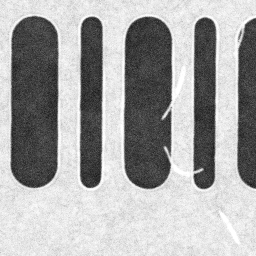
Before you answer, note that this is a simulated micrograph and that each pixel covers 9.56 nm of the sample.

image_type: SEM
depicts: groups of lines, slits or small figures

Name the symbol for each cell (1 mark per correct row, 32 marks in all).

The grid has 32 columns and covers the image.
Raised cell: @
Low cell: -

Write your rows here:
@@@@@@@@@@@@@@@@@@@@@@@@@@@@@@@@
@@@@@@@@@@@@@@@@@@@@@@@@@@@@@@@@
@@----@@@@---@@@@---@@@@@--@@@@-
@@-----@@@---@@@-----@@@---@@@--
@------@@@---@@@-----@@@---@@@--
@------@@@---@@@------@@---@@@--
@------@@@---@@-------@@---@@@--
@------@@@---@@-------@@---@@@--
@------@@@---@@-------@@---@@@--
@------@@@---@@-------@@---@@@--
@------@@@---@@-------@@---@@@--
@------@@@---@@-------@@---@@@--
@------@@@---@@-------@@---@@@--
@------@@@---@@------@@@---@@@--
@------@@@---@@-------@@---@@@--
@------@@@---@@-------@@---@@@--
@------@@@---@@-------@@---@@@--
@------@@@---@@-------@@---@@@--
@------@@@---@@-------@@---@@@--
@------@@@---@@------@@@---@@@--
@------@@@---@@------@@@---@@@--
@------@@@---@@@-----@@@---@@@--
@@-----@@@---@@@-----@@@---@@@--
@@@@-@@@@@@-@@@@@@-@@@@@@-@@@@@-
@@@@@@@@@@@@@@@@@@@@@@@@@@@@@@@@
@@@@@@@@@@@@@@@@@@@@@@@@@@@@@@@@
@@@@@@@@@@@@@@@@@@@@@@@@@@@@@@@@
@@@@@@@@@@@@@@@@@@@@@@@@@@@@@@@@
@@@@@@@@@@@@@@@@@@@@@@@@@@@@@@@@
@@@@@@@@@@@@@@@@@@@@@@@@@@@@@@@@
@@@@@@@@@@@@@@@@@@@@@@@@@@@@@@@@
@@@@@@@@@@@@@@@@@@@@@@@@@@@@@@@@